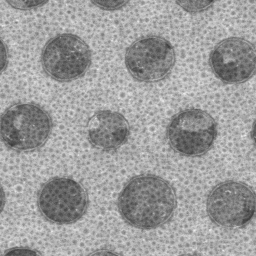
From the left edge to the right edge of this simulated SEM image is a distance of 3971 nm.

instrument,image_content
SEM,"raised bodies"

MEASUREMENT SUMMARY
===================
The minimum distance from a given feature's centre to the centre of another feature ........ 1280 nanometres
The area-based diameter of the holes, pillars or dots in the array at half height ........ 0.709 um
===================